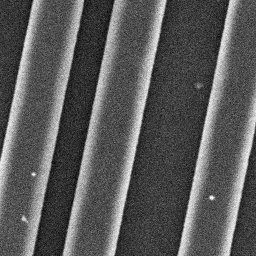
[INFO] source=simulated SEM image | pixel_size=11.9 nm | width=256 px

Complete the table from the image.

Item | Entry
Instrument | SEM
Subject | lines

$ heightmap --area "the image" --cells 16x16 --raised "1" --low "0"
0011100111000011
0011100111000011
0011100111000011
0111000111000011
0111001110000011
0111001110000111
0111001110000111
0111001110000111
1110001110000111
1110011100000111
1110011100001110
1110011100001110
1110011100001110
1100111100001110
1100111000001110
1100111000011100